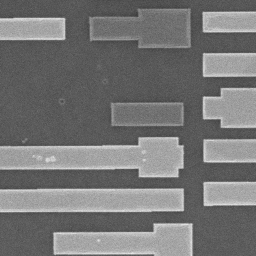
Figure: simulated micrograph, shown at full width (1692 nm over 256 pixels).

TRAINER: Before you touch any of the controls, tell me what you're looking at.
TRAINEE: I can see wiring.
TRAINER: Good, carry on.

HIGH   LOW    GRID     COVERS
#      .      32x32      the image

................................
.................#######........
########...#############.#######
########...#############.#######
########...#############........
.................#######........
................................
.........................#######
.........................#######
................................
................................
............................####
.........................#######
..............#########..#######
..............#########..#######
..............#########.....####
................................
..................####..........
#######################...######
#######################...######
#######################.........
.................#####..........
................................
..........................######
#######################...######
#######################...######
................................
................................
...................#####........
.......#################........
.......#################........
.......#################........